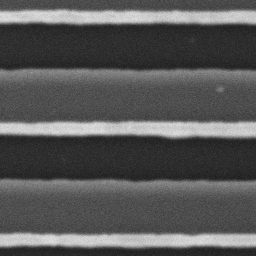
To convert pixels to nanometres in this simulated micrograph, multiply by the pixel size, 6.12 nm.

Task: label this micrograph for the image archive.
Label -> lines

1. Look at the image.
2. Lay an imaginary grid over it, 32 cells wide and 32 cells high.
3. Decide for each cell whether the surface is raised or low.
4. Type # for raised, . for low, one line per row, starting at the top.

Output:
################################
################################
################################
................................
................................
................................
................................
................................
................................
################################
################################
################################
################################
################################
################################
################################
################################
................................
................................
................................
................................
................................
................................
################################
################################
################################
################################
################################
################################
################################
################################
................................